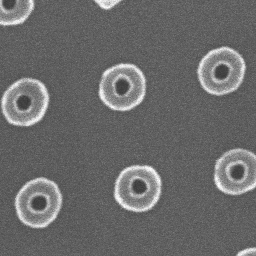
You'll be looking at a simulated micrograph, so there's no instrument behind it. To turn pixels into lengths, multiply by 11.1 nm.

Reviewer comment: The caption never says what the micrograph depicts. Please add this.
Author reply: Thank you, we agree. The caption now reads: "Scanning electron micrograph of ring-shaped raised bodies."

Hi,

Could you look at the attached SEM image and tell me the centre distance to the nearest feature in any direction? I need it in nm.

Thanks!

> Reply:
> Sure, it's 1110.